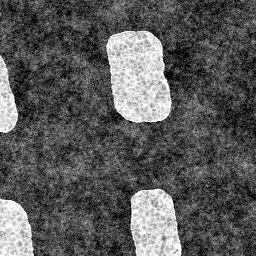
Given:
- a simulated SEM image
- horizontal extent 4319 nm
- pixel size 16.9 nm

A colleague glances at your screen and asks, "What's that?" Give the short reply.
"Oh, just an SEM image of raised bodies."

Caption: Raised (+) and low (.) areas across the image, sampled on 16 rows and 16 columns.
................
................
.......+++......
.......+++......
.......+++......
+......++++.....
+......++++.....
+.......++......
................
................
................
................
........+++.....
++......+++.....
++......+++.....
++.......++.....